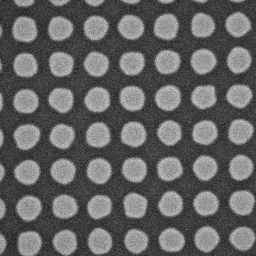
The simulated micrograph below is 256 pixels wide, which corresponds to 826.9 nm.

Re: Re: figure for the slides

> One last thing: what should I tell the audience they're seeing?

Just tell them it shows an array of small figures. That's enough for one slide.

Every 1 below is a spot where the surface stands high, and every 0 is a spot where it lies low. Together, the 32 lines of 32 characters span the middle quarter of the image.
11000111111000111111000111111000
11000011111000011110000011110000
10000001110000001100000000000000
00000000000000000000000000000000
00000000000000000000000000000000
00000000000000000000000000100000
10000001110000011110000011111000
11000011111000111111000111111000
11000111111000111111000111111000
11000111111000111111000111111000
11000011111000011111000011110000
10000011110000001100000000000000
00000000000000000000000000000000
00000000000000000000000000000000
00000000000000000000000001100000
10000001111000011111000011111000
11000011111000011111000011111000
11000011111000111111000011111000
11000011111000111111000011111000
11000011111000011111000001110000
10000001110000000100000000000000
00000000000000000000000000000000
00000000000000000000000000000000
00000000000000000000000000110000
11000001111000011111000011111000
11000011111000011111000111111000
11100011111100011111000011111000
11100011111100011111000011111000
11000011111000001111000011110000
10000000110000000000000000000000
00000000000000000000000000000000
00000000000000000000000000000000